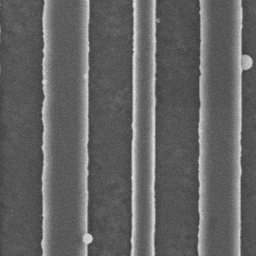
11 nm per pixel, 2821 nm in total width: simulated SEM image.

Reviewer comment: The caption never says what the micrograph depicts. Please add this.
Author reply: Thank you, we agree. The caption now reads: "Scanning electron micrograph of lines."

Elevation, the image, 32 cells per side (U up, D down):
DDDDDDUUUUUDDDDDDUUDDDDDDUUUUUDD
DDDDDUUUUUUDDDDDDUUDDDDDDUUUUUDD
DDDDDUUUUUUDDDDDDUUDDDDDDUUUUUDD
DDDDDUUUUUUDDDDDDUUDDDDDDUUUUUDD
DDDDDUUUUUUDDDDDDUUDDDDDDUUUUUDD
DDDDDDUUUUUDDDDDDUUDDDDDDUUUUUDD
DDDDDUUUUUUDDDDDDUUDDDDDDUUUUUDD
DDDDDUUUUUUDDDDDDUUDDDDDDUUUUUUD
DDDDDUUUUUUDDDDDDUUDDDDDDUUUUUUD
DDDDDUUUUUUDDDDDDUUDDDDDDUUUUUDD
DDDDDUUUUUUDDDDDDUUDDDDDDUUUUUDD
DDDDDDUUUUUDDDDDDUUDDDDDDUUUUUDD
DDDDDDUUUUUDDDDDDUUDDDDDDUUUUUDD
DDDDDUUUUUUDDDDDDUUDDDDDDUUUUUDD
DDDDDUUUUUUDDDDDDUUDDDDDDUUUUUDD
DDDDDUUUUUUDDDDDDUUDDDDDDUUUUUDD
DDDDDUUUUUUDDDDDDUUDDDDDDUUUUUDD
DDDDDUUUUUUDDDDDDUUDDDDDDUUUUUDD
DDDDDUUUUUUDDDDDDUUDDDDDDUUUUUDD
DDDDDDUUUUUDDDDDDUUDDDDDDUUUUUDD
DDDDDUUUUUUDDDDDDUUDDDDDDUUUUUDD
DDDDDUUUUUUDDDDDDUUDDDDDDUUUUUDD
DDDDDUUUUUUDDDDDDUUDDDDDDUUUUUDD
DDDDDUUUUUUDDDDDDUUDDDDDDUUUUUDD
DDDDDUUUUUUDDDDDDUUDDDDDDUUUUUDD
DDDDDUUUUUUDDDDDDUUDDDDDDUUUUUDD
DDDDDUUUUUUDDDDDDUUDDDDDDUUUUUDD
DDDDDUUUUUUDDDDDDUUDDDDDDUUUUUDD
DDDDDUUUUUUDDDDDDUUDDDDDDUUUUUDD
DDDDDUUUUUUDDDDDDUUDDDDDDUUUUUDD
DDDDDUUUUUUDDDDDDUUDDDDDDUUUUUDD
DDDDDUUUUUUDDDDDDUUDDDDDDUUUUUDD